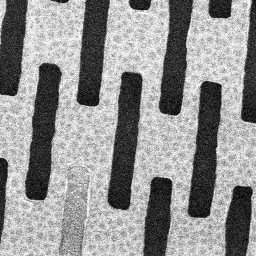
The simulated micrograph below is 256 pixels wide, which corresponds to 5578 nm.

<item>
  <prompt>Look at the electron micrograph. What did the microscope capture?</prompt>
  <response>holes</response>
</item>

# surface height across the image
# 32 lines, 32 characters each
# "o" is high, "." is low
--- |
o...ooooooo...oo...oo...oo...oo.
....ooooooo...ooooooo...oo...oo.
...ooooooo....ooooooo...ooooooo.
...ooooooo...oooooooo...ooooooo.
...ooooooo...oooooooo..oooooooo.
...ooooooo...oooooooo..oooooooo.
...ooooooo...oooooooo..oooooooo.
...ooooooo...ooooooo...oooooooo.
...oo..ooo...ooooooo...oooooooo.
...oo...oo...oo...oo...ooooooo..
..ooo..ooo...oo...oo...oo..ooo..
..ooo..ooo..ooo...oo...oo...oo..
oooo...ooo..ooo...oo...oo...oo..
oooo...oooooooo...oo...oo...oo..
oooo...oooooooo...ooo.ooo...oo..
oooo...ooooooo...oooooooo..ooooo
oooo...ooooooo...oooooooo..ooooo
oooo...ooooooo...ooooooo...ooooo
oooo..oooooooo...oooooooo..ooooo
oooo..oooooooo...ooooooo...ooooo
.ooo..oooooooo...ooooooo...ooooo
.oo...oooooooo...ooooooo...ooooo
.oo...oooooooo...oo..ooo...ooooo
.oo...oooooooo..ooo...oo...oo..o
.oo...ooooooo...ooo...oo...oo..o
.ooooooo...ooo..oo...ooo...oo..o
.ooooooo...ooooooo...oo...oo...o
.ooooooo...ooooooo...ooooooo...o
oooooooo...ooooooo...ooooooo...o
oooooooo..oooooooo...ooooooo...o
ooooooo...oooooooo...ooooooo...o
ooooooo...oooooooo...ooooooo...o